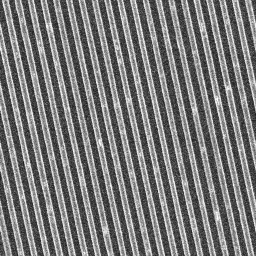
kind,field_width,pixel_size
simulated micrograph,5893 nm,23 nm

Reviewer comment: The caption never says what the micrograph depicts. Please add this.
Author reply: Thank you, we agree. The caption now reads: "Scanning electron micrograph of parallel lines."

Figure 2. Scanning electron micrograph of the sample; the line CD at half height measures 5.62 px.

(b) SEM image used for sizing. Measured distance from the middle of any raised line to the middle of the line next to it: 287 nanometers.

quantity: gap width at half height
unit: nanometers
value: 174